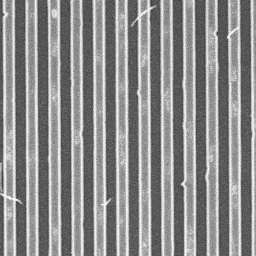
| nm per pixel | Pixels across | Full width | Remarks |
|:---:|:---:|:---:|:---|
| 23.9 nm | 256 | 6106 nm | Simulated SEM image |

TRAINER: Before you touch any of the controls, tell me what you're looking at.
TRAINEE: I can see parallel lines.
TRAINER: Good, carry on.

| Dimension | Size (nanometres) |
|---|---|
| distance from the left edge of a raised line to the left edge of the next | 538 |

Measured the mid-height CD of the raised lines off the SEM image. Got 0.259 microns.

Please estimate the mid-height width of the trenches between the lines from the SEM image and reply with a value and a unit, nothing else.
280 nanometers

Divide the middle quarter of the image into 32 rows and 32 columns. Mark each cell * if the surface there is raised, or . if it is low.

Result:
..**....**...***...**....**...**
..**....**...***...**....**...**
..**....**...***...**....**...**
..**....**...***...**....**...**
..***...**...***...**....**...**
..***...**...***...**...***...**
..***...**...***...**...***...**
..***...**...***...**...***...**
..**....**...***...**....**...**
..***...**...***...**....**...**
..**....**...***...**....**...**
..**....**...***...**...***...**
..**....**...***...**...***...**
..**....**...***...**...***...**
..**....**...***...**...***...**
..**....**...***...**...***...**
..**....**...***...**...***...**
..**....**...***...**...***...**
..**....**...***...**...***...**
..**....**...***...**...***...**
..**....**...***...**...***...**
..**....**...***...**....**...**
..**....**...***...**....**...**
..**....**...***...**....**...**
..***...**...***...**....**...**
..***...**...***...**....**...**
..**....**...***...**....**...**
..**....**...***...**....**...**
..**....**...***...**....**...**
..**....**...***...**....**...**
..**....**...***...**....**...**
..***...**...***...**....**...**